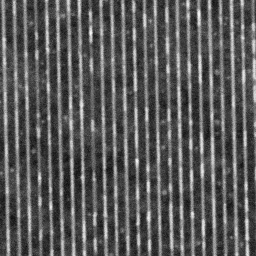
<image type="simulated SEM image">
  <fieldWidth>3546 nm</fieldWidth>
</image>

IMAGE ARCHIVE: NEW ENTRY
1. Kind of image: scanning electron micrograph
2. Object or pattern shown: parallel lines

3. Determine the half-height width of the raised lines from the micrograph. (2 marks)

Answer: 22.5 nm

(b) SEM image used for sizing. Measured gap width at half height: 126 nm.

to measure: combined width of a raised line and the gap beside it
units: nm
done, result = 150